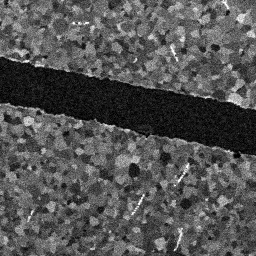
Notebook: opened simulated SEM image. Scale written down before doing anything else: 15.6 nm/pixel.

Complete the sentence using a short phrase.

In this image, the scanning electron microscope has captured one or a few lines or trenches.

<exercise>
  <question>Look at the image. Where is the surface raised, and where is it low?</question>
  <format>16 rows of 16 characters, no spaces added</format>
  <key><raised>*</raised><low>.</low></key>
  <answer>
****************
****************
****************
****************
.....***********
..........******
...............*
*****...........
**********......
**************..
****************
****************
****************
****************
****************
****************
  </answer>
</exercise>